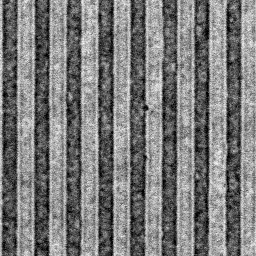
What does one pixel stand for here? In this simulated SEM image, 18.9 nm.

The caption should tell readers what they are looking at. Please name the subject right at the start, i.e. parallel lines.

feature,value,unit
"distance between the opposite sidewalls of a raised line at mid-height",270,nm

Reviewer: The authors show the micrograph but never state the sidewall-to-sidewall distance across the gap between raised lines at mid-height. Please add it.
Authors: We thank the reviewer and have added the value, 343 nm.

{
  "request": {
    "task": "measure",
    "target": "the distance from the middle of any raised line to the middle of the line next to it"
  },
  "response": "605 nm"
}